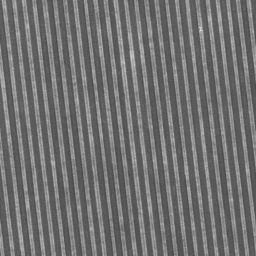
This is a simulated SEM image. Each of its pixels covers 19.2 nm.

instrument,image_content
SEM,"parallel lines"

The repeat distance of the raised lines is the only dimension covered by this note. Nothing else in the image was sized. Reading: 0.195 µm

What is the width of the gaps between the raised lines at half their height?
131 nanometres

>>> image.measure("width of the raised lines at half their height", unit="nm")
66.8